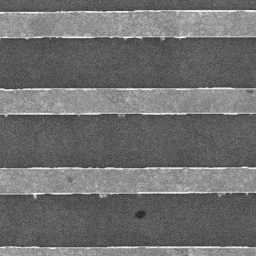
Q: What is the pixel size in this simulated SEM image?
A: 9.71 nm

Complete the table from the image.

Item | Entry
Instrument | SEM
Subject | lines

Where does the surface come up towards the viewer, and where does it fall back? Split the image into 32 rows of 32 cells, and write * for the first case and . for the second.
................................
........************************
********************************
********************************
********************************
................................
................................
................................
................................
................................
................................
********************************
********************************
********************************
................................
................................
................................
................................
................................
................................
................................
********************************
********************************
********************************
................................
................................
................................
................................
................................
................................
................................
********************************